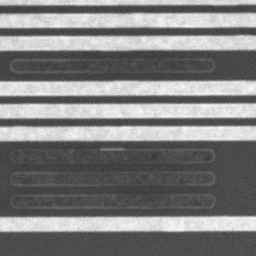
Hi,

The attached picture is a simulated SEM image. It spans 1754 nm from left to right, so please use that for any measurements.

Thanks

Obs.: groups of lines, slits or small figures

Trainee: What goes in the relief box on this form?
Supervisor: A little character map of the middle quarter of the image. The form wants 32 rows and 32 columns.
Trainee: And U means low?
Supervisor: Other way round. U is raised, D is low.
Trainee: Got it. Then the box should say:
UUUUUUUUUUUUUUUUUUUUUUUUUUUUUUUU
UUUUUUUUUUUUUUUUUUUUUUUUUUUUUUUU
DDDDDDDDDDDDDDDDDDDDDDDDDDDDDDDD
DDDDDDDDDDDDDDDDDDDDDDDDDDDDDDDD
DDDDDDDDDDDDDDDDDDDDDDDDDDDDDDDD
UUUUUUUUUUUUUUUUUUUUUUUUUUUUUUUU
UUUUUUUUUUUUUUUUUUUUUUUUUUUUUUUU
UUUUUUUUUUUUUUUUUUUUUUUUUUUUUDDD
DDDDDDDDDDDDDDDDDDDDDDDDDDDDDDDD
DDDDDDDDDDDDDDDDDDDDDDDDDDDDDDDD
UUUUUUUUUUUUUUUUUUUUUUUUUUUUUUUU
UUUUUUUUUUUUUUUUUUUUUUUUUUUUUUUU
UUUUUUUUUUUUUUUUUUUUUUUUUUUUUUUU
DDDDDDDDDDDDDDDDDDDDDDDDDDDDDDDD
DDDDDDDDDDDDDDDDDDDDDDDDDDDDDDDD
DDDDDDDDDDDDDDDDDDDDDDDDDDDDDDDD
UUUUUUUUUUUUUUUUUUUUUUUUUUUUUUUU
UUUUUUUUUUUUUUUUUUUUUUUUUUUUUUUU
UUUUUUUUUUUUUUUUUUUUUUUUUUUUUUUU
DDDDDDDDDDDDDDDDDDDDDDDDDDDDDDDD
DDDDDDDDDDDDDDDDDDDDDDDDDDDDDDDD
DDDDDDDDDDDDDDDDDDDDDDDDDDDDDDDD
UUUUUUUUUUUUUUUUUUUUUUUUUUUUUUUU
UUUUUUUUUUUUUUUUUUUUUUUUUUUUUUUU
UUUUDDDDDDDDDDDDDDDDDDDDDDDDDDDD
DDDDDDDDDDDDDDDDDDDDDDDDDDDDDDDD
DDDDDDDDDDDDDDDDDDDDDDDDDDDDDDDD
UUUUUUUUUUUUUUUUUUUUUUUUUUUUUUUU
UUUUUUUUUUUUUUUUUUUUUUUUUUUUUUUU
UUUUUUUUUUUUUUUUUUUUUUUUUUUUUUUU
DDDDDDDDDDDDDDDDDDDDDDDDDDDDDDDD
DDDDDDDDDDDDDDDDDDDDDDDDDDDDDDDD